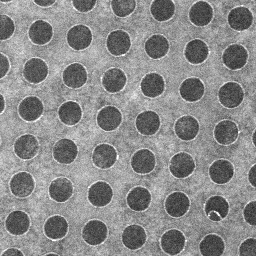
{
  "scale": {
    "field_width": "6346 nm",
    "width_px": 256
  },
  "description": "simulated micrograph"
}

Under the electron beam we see a regular array of raised bodies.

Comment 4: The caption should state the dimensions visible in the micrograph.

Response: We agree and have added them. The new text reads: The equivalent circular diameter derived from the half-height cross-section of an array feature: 652 nm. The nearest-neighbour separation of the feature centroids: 943 nanometers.